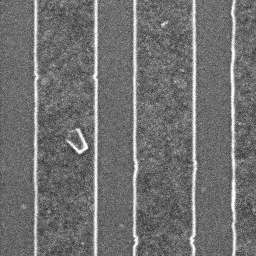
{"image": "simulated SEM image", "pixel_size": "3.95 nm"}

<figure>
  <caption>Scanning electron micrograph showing one or a few lines or trenches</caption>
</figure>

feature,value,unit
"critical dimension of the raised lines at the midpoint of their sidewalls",239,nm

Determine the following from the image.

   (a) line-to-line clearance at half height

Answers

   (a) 150 nanometers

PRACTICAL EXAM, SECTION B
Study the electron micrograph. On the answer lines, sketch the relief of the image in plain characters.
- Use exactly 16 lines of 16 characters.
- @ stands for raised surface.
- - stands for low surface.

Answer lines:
--@@@@--@@@@---@
--@@@@--@@@@---@
--@@@@--@@@@---@
--@@@@--@@@@---@
--@@@@--@@@@--@@
--@@@@--@@@@--@@
--@@@@--@@@@--@@
--@@@@--@@@@---@
--@@@@--@@@@---@
--@@@@--@@@@---@
--@@@@--@@@@---@
--@@@@--@@@@---@
--@@@@--@@@@---@
--@@@@--@@@@---@
--@@@@--@@@@---@
--@@@@--@@@@---@